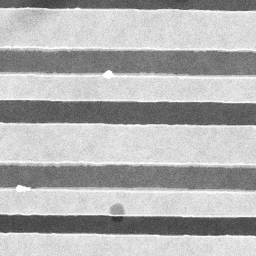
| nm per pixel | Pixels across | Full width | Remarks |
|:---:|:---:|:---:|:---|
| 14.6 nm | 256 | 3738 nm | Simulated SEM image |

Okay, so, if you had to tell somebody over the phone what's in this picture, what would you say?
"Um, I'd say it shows lines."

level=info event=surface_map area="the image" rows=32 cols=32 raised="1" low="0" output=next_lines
00000000000000000000000000000000
11111111111111111111111111111111
11111111111111111111111111111111
11111111111111111111111111111111
11111111111111111111111111111111
11111111111111111111111111111111
00000000000000000000000000000000
00000000000000000000000000000000
00000000000000000000000000000000
11111111111111111111111000000000
11111111111111111111111111111111
11111111111111111111111111111111
00000011111111111111111111111111
00000000000000000000000000000000
00000000000000000000000000000000
11000000000000000000000000000000
11111111111111111111111111111111
11111111111111111111111111111111
11111111111111111111111111111111
11111111111111111111111111111111
00000000000010001101111111111111
00000000000000000000000000000000
00000000000000000000000000000000
00100000000000000000000000000000
11111111111111111111111111111111
11111111111111111111111111111111
11111111111111111111111111111111
00000000000000000000000000000000
00000000000000000000000000000000
11111111111111111111000100001000
11111111111111111111111111111111
11111111111111111111111111111111